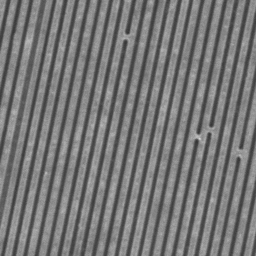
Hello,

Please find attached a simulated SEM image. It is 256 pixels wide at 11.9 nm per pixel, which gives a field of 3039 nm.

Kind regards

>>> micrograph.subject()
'parallel lines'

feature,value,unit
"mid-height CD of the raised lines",6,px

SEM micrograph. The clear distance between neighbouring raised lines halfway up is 59.6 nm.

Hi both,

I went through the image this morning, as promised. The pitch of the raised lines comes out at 0.133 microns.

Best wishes